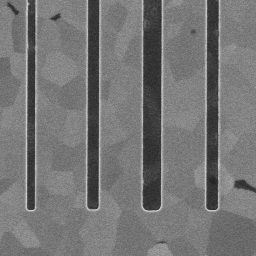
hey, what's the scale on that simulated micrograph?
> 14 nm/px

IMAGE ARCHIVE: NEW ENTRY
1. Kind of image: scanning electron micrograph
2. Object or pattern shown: one or a few lines or trenches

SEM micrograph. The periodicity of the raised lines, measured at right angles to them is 856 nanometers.